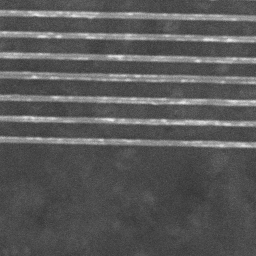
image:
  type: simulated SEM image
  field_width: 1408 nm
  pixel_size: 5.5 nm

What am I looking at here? parallel lines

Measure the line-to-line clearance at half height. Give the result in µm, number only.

0.0879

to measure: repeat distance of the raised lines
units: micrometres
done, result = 0.116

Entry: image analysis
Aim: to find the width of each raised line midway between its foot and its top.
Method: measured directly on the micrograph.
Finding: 28.2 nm